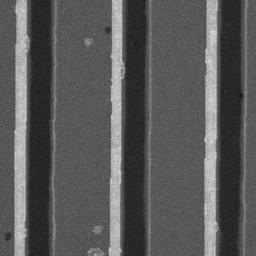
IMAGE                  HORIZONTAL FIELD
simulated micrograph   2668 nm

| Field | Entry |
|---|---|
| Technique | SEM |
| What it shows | lines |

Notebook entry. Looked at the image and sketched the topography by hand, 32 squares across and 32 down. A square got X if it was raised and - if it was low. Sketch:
XXX----XXXXXXXX----XXXXXXXX----X
XXX----XXXXXXXX----XXXXXXXX----X
XXX----XXXXXXXX----XXXXXXXX----X
XXX----XXXXXXXX----XXXXXXXX----X
XXX----XXXXXXXX----XXXXXXXX----X
XXXX---XXXXXXXX----XXXXXXXX----X
XXX----XXXXXXXX----XXXXXXXX----X
XXX----XXXXXXXX----XXXXXXXX----X
XXX----XXXXXXXXX---XXXXXXXX----X
XXX----XXXXXXXX----XXXXXXXX----X
XXX----XXXXXXXX----XXXXXXXX----X
XXX----XXXXXXXX----XXXXXXXX----X
XXX----XXXXXXXX----XXXXXXXX----X
XXX----XXXXXXXX----XXXXXXXX----X
XXX----XXXXXXXX----XXXXXXXX----X
XXX----XXXXXXXX----XXXXXXXX----X
XXX----XXXXXXXX----XXXXXXXX----X
XXX----XXXXXXXX----XXXXXXXX----X
XXX----XXXXXXXX----XXXXXXXX----X
XXX----XXXXXXXX----XXXXXXXX----X
XXX----XXXXXXXX----XXXXXXXX----X
XXX----XXXXXXXX----XXXXXXXX----X
XXX----XXXXXXXX----XXXXXXXX---XX
XXX----XXXXXXXX----XXXXXXXX---XX
XXX----XXXXXXXX----XXXXXXXX---XX
XXX----XXXXXXXX----XXXXXXXX---XX
XXX----XXXXXXXX----XXXXXXXX---XX
XXX----XXXXXXXX----XXXXXXXX---XX
XXX----XXXXXXXX----XXXXXXXX---XX
XXX----XXXXXXXX----XXXXXXXX---XX
XXX----XXXXXXXX----XXXXXXXX---XX
XXX----XXXXXXXX----XXXXXXXX---XX